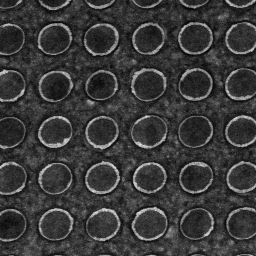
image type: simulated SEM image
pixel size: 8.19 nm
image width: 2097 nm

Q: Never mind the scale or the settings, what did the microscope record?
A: a regular array of raised bodies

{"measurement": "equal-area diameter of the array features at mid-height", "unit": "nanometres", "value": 267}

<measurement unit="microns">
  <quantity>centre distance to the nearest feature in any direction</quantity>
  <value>0.376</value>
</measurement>